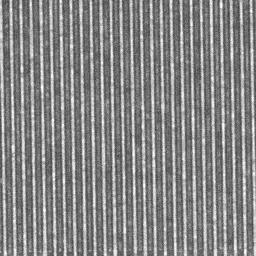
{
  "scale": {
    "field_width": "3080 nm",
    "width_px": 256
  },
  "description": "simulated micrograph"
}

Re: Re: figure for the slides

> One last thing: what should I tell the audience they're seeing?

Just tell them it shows parallel lines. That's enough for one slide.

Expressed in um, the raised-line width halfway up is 0.0195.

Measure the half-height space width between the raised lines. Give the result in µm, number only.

0.0376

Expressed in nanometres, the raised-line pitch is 60.2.